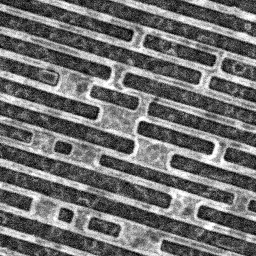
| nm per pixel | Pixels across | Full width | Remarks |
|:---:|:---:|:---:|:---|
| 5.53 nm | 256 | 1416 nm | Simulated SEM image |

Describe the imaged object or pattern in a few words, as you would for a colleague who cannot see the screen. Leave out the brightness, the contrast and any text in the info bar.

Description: parallel lines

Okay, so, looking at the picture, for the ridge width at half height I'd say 32.4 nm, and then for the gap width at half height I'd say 0.0899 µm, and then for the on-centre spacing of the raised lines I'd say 117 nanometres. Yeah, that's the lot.